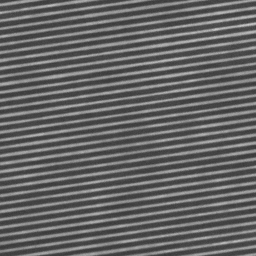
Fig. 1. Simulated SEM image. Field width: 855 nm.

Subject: parallel lines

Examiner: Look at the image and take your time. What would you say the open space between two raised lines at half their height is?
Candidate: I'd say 0.0198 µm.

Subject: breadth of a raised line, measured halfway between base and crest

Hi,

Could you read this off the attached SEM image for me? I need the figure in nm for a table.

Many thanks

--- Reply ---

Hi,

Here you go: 6.6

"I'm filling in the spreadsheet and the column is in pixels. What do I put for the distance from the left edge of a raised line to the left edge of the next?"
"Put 7.87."